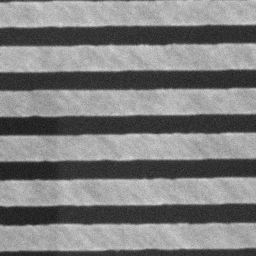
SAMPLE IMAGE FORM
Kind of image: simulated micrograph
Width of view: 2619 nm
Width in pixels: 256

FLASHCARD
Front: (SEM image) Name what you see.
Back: lines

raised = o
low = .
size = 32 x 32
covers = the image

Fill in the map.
oooooooooooooooooooooooooooooooo
oooooooooooooooooooooooooooooooo
oooooooooooooooooooooooooooooooo
................................
................................
................................
oooooooooooooooooooooooooooooooo
oooooooooooooooooooooooooooooooo
oooooooooooooooooooooooooooooooo
................................
................................
oooooooooooooooooooooooooooooooo
oooooooooooooooooooooooooooooooo
oooooooooooooooooooooooooooooooo
oooooooo.o......................
................................
................................
oooooooooooooooooooooooooooooooo
oooooooooooooooooooooooooooooooo
oooooooooooooooooooooooooooooooo
................................
................................
..................oooooooooooooo
oooooooooooooooooooooooooooooooo
oooooooooooooooooooooooooooooooo
oooooooooooooooooooooo..........
................................
................................
oooooooooooooooooooooooooooooooo
oooooooooooooooooooooooooooooooo
oooooooooooooooooooooooooooooooo
................................